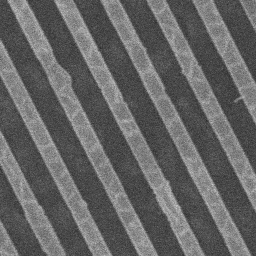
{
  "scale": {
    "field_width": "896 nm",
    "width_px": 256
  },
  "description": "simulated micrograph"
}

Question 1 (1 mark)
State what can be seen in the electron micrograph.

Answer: parallel lines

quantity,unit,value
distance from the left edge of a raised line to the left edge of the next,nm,144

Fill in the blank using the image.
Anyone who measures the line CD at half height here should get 0.052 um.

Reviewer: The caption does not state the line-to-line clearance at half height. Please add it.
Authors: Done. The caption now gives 93.6 nanometres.